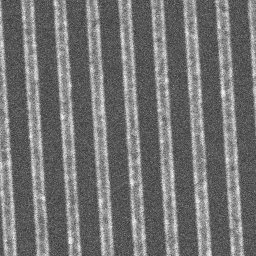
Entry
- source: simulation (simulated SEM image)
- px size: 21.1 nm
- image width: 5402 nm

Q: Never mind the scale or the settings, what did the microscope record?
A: parallel lines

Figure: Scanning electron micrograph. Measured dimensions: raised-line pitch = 32.4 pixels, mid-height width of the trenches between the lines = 0.482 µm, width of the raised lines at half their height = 200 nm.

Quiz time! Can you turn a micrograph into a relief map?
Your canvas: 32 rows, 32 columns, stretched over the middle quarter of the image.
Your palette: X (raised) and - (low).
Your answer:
X------XX------XX------XX------X
X------XX------XX------XX------X
X------XX------XX------XX------X
X------XX------XX------XXX-----X
X------XX-------X------XXX------
X------XX-------X-------XX------
X------XX-------X-------XX------
X------XX-------X-------XX------
X------XX-------XX------XX------
X-------X-------XX------XX------
X-------XX------XX------XX------
X-------XX------XX------XX------
XX------XX------XX------XX------
XX------XX------XX------XX------
XX------XX------XX------XX------
XX------XX------XX------XX------
XX------XX------XX------XX------
XX------XX------XX------XX------
XX------XX------XX------XX------
XX------XX------XX------XXX-----
XX------XX------XX------XXX-----
XX------XX------XXX-----XXX-----
XX------XX------XXX------XX-----
XX------XX------XXX------XX-----
XX------XX-------XX------XX-----
XX-------X-------XX------XX-----
XX-------XX------XX------XX-----
-X-------XX------XX------XX-----
-XX------XX------XX------XX-----
-XX------XX------XX------XX-----
-XX------XX------XX------XX-----
-XX------XX------XX------XX-----